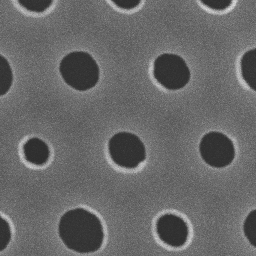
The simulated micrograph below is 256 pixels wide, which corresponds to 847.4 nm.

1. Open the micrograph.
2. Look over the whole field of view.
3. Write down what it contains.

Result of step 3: holes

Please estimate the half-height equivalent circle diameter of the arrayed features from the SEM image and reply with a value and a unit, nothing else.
121 nm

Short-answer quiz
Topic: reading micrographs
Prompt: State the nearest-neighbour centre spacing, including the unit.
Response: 301 nm